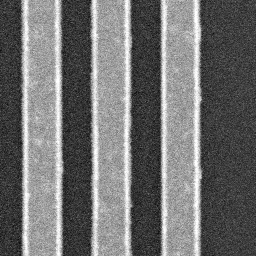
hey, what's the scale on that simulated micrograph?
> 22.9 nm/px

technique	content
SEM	one or a few lines or trenches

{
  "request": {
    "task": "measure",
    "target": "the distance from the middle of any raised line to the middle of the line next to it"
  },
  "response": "1580 nm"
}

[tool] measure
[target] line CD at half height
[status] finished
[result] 723 nm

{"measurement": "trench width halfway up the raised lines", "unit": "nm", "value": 857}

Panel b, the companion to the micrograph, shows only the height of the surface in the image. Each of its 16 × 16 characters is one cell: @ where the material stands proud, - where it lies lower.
--@@--@@--@@----
--@@--@@--@@----
--@@--@@--@@----
--@@--@@--@@----
--@@--@@--@@----
--@@--@@--@@----
--@@--@@--@@----
--@@--@@--@@----
--@@--@@--@@----
--@@--@@--@@----
--@@--@@--@@----
--@@--@@--@@----
--@@--@@--@@----
--@@--@@--@@----
--@@--@@--@@----
--@@--@@--@@----